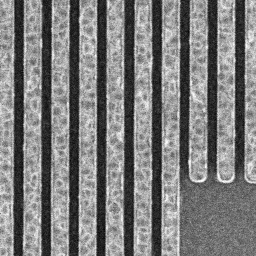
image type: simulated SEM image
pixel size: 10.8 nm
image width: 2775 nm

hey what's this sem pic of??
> parallel lines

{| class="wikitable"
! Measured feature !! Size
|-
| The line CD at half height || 190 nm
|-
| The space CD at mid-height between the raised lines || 10.1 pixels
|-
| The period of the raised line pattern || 300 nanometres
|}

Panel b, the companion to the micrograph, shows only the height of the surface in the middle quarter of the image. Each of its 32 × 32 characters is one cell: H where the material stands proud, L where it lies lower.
HLLLHHHHLLLHHHHLLLHHHHLLLHHHHLLL
HLLLHHHHLLLHHHHLLLHHHHLLLHHHHLLL
HLLLHHHHLLLHHHHLLLHHHHLLLHHHHLLL
HLLLHHHHLLLHHHHLLLHHHHLLLHHHHLLL
HLLLHHHHLLLHHHHLLLHHHHLLLHHHHLLL
HLLLHHHHLLLHHHHLLLHHHHLLLHHHHLLL
HLLLHHHHLLLHHHHLLLHHHHLLLHHHHLLL
HLLLHHHHLLLHHHHLLLHHHHLLLHHHHLLL
HLLLHHHHLLLHHHHLLLHHHHLLLHHHHLLH
HLLLHHHHLLLHHHHLLLHHHHLLLHHHHLLH
HLLLHHHHLLLHHHHLLLHHHHLLLHHHHLLH
HLLLHHHHLLLHHHHLLLHHHHLLLHHHHLLH
HLLLHHHHLLLHHHHLLLHHHHLLLHHHHLLH
HLLLHHHHLLLHHHHLLLHHHHLLLHHHHLLH
HLLLHHHHLLLHHHHLLLHHHHLLLHHHHLLH
HLLLHHHHLLLHHHHLLLHHHHLLLHHHHLLH
HLLLHHHHLLLHHHHLLLHHHHLLLHHHHLLH
HLLLHHHHLLLHHHHLLLHHHHLLLHHHHLLH
HLLLHHHHLLLHHHHLLLHHHHLLLHHHHLLH
HLLLHHHHLLLHHHHLLLHHHHLLHHHHHLLH
HLLLHHHHLLLHHHHLLLHHHHLLHHHHHLLH
HLLLHHHHLLLHHHHLLLHHHHLLLHHHHLLH
HLLLHHHHLLLHHHHLLLHHHHLLLHHHHLLH
HLLLHHHHLLLHHHHLLLHHHHLLLHHHHLLH
HLLLHHHHLLLHHHHLLLHHHHLLLHHHHLLH
HLLLHHHHLLLHHHHLLLHHHHLLLHHHHLLH
HLLLHHHHLLLHHHHLLLHHHHLLLHHHHLLH
HLLLHHHHLLLHHHHLLLHHHHLLHHHHHLLH
HLLLHHHHLLLHHHHLLLHHHHLLHHHHHLLL
HLLLHHHHLLLHHHHLLLHHHHLLLHHHHLLL
HLLLHHHHLLLHHHHLLLHHHHLLLHHHHLLL
HLLLHHHHLLLHHHHLLLHHHHLLLHHHHLLL